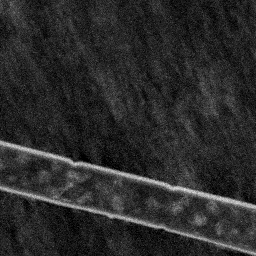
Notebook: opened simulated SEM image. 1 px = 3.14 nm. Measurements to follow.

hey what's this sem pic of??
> one or a few lines or trenches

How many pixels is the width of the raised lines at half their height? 44.2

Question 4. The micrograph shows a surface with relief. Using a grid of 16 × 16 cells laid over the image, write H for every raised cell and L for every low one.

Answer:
LLLLLLLLLLLLLLLL
LLLLLLLLLLLLLLLL
LLLLLLLLLLLLLLLL
LLLLLLLLLLLLLLLL
LLLLLLLLLLLLLLLL
LLLLLLLLLLLLLLLL
LLLLLLLLLLLLLLLL
LLLLLLLLLLLLLLLL
LLLLLLLLLLLLLLLL
HHLLLLLLLLLLLLLL
HHHHHHLLLLLLLLLL
HHHHHHHHHHLLLLLL
LLLHHHHHHHHHHHLL
LLLLLLLHHHHHHHHH
LLLLLLLLLLLHHHHH
LLLLLLLLLLLLLLLH